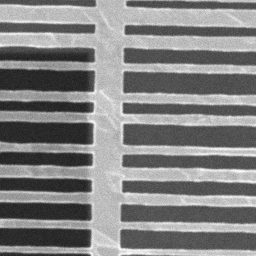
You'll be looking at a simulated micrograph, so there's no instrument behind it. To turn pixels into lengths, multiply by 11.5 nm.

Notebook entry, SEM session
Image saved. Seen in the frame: groups of lines, slits or small figures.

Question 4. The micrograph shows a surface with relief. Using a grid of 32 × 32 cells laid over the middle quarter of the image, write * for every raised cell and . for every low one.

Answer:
********************************
.......*************************
........*******.................
........*******.................
........******..................
........******..................
........******..................
***************.................
********************************
.......********..***************
........******..................
........******..................
***************.................
********************************
.......*************************
........******..................
........******..................
........******..................
........******..................
........******..................
*****************...............
********************************
.......********.........********
.......*******..................
.......*******..................
.......*******..................
********************************
********************************
.....***************************
.......*******..................
.......*******..................
.......*******..................